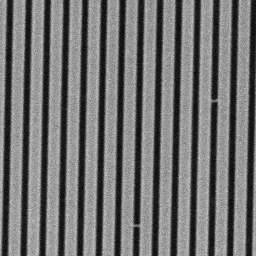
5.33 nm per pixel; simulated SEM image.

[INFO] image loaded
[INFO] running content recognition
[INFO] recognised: parallel lines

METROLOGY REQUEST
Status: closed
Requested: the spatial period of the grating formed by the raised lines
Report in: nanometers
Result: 100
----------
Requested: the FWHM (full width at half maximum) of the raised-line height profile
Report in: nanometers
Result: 61.3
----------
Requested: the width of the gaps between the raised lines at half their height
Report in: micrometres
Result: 0.036